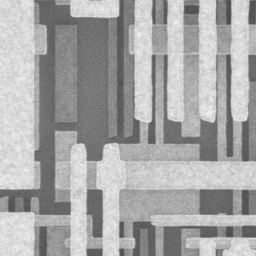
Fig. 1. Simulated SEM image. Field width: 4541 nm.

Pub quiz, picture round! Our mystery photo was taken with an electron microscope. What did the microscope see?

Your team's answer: wiring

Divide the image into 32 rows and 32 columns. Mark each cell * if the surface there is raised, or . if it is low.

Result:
****.....******..**..**..**..**.
****.....******..**..**..**..**.
****.............**..**..**..**.
****.............**..**..**..**.
****.............**..**..**..**.
****.............**..**..**..**.
****.............**..**..**..**.
****.............**..**..**..**.
****.............**..**..**..**.
****.............**..**..**..**.
****.............**..**..**..**.
****.............**..**..**..**.
****.............**..**..**..**.
****.............**..**..**..**.
****.............**..**..**..**.
****............................
****............................
****............................
****.....**..**.................
****.....**..**.................
****.....**.***.................
****.....**.****................
****.....**.****................
****.....**.***.................
.........**..**.................
.........**..**.................
.........**..**.................
****.....**..**.................
****.....**..**.................
****.....**..**.................
****.....**..**..........**..**.
****.....**..**..........**.****